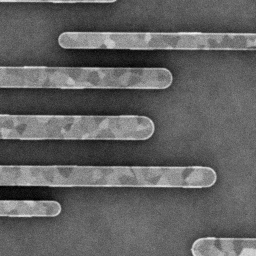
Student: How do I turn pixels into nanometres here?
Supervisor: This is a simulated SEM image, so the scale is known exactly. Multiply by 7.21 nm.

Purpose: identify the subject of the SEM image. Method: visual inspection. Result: groups of lines, slits or small figures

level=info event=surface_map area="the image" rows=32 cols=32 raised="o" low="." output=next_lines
................................
................................
................................
................................
........oooooooooooooooooooooooo
........oooooooooooooooooooooooo
................................
................................
oooooooo........................
ooooooooooooooooooooo...........
ooooooooooooooooooooo...........
................................
................................
................................
ooo.............................
ooooooooooooooooooo.............
ooooooooooooooooooo.............
................................
................................
................................
................................
ooooooooooooooooooooooooooo.....
ooooooooooooooooooooooooooo.....
................................
................................
ooooooo.........................
ooooooo.........................
................................
................................
................................
........................oooooooo
........................oooooooo